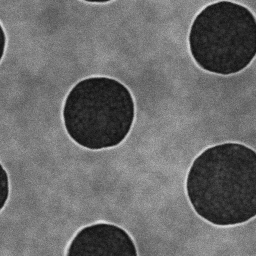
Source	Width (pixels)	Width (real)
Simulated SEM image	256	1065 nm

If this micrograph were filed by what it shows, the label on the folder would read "holes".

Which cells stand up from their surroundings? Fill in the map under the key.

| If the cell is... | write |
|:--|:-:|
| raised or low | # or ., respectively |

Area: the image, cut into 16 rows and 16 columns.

#############..#
############....
############....
############....
#############..#
#####...########
####....########
####....########
####....########
#############...
############....
.###########....
############....
#############...
#####...########
####....########